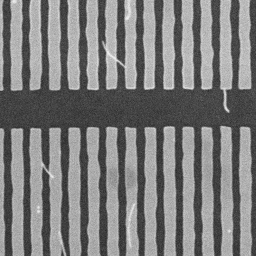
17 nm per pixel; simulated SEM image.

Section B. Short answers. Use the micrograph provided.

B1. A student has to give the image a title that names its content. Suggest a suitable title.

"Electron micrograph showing groups of lines, slits or small figures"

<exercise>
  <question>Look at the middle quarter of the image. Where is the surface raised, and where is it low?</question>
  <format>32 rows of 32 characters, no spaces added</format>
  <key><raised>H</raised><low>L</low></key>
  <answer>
LHHHLLHHLLLHHLLLHHLLHHLLLHHLLLHH
LHHHLLHHLLLHHLLLHHLLHHLLLHHLLLHH
LHHHLLHHLLLHHLLLHHLLHHLLLHHLLLHH
LHHHLLHHLLLHHLLLHHLLHHLLLHHLLLHH
LHHHLLHHLLLHHLLLHHLLHHLLLHHLLLHH
LHHHLLHHLLLHHLLLHHLLHHLLLHHLLLHH
LLLLLLLLLLLLLLLLLLLLLLLLLLLLLLLL
LLLLLLLLLLLLLLLLLLLLLLLLLLLLLLLL
LLLLLLLLLLLLLLLLLLLLLLLLLLLLLLLL
LLLLLLLLLLLLLLLLLLLLLLLLLLLLLLLL
LLLLLLLLLLLLLLLLLLLLLLLLLLLLLLLL
LLLLLLLLLLLLLLLLLLLLLLLLLLLLLLLL
LLLLLLLLLLLLLLLLLLLLLLLLLLLLLLLL
LLLLLLLLLLLLLLLLLLLLLLLLLLLLLLLL
LLLLLLLLLLLLLLLLLLLLLLLLLLLLLLLL
LLLLLLLLLLLLLLLLLLLLLLLLLLLLLLLL
LHHHLLHHHLLHHLLLHHLLHHHLLHHHLLHH
LHHHLLHHHLLHHLLLHHLLHHHLLHHHLLHH
LHHHLLHHHLLHHLLLHHLLHHHLLHHHLLHH
LHHHLLHHHLLHHLLLHHLLLHHLLHHHLLHH
LHHHLLHHHLLHHLLLHHLLHHHLLHHHLLHH
LLHHLLHHLLLHHLLLHHLLHHHLLHHHLLHH
LHHHLLHHLLLHHLLLHHLLHHHLLHHHLLHH
LHHHLLHHLLLHHLLLHHLLHHHLLHHHLLHH
LHHHLLHHHLLHHLLLHHLLHHHLLHHHLLHH
LHHHLLHHHLLHHLLHHHLLHHHLLHHHLLHH
LHHHLLHHHLLHHLLHHHLLHHHLLHHHLLHH
LHHHLLHHHLLHHLLHHHLLHHHLLHHHLLHH
LHHHLLHHHLLHHLLLHHLLHHHLLHHHLLHH
LHHHLLHHHLLHHLLLHHLLLHHLLHHHLLHH
LHHHLLHHLLLHHLLLHHLLHHHLLHHHLLHH
LHHHLLHHHLLHHLLLHHLLHHHLLHHHLLHH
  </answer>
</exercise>